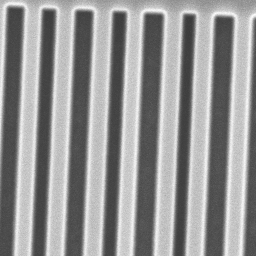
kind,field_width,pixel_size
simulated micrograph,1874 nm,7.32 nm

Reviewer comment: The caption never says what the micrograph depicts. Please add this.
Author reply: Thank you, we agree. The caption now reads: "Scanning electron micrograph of parallel lines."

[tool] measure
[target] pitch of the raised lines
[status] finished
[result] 257 nm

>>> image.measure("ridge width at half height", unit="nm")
131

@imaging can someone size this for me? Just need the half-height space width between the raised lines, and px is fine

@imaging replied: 18.6